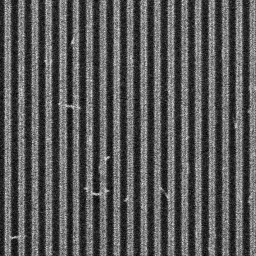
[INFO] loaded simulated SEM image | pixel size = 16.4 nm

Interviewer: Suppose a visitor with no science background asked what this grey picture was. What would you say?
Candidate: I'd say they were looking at parallel lines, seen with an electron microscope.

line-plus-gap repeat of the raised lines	222	nanometres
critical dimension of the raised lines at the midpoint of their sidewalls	100	nm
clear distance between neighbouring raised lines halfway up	129	nanometres